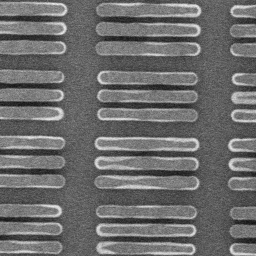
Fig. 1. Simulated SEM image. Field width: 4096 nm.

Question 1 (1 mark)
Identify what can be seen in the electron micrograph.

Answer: groups of lines, slits or small figures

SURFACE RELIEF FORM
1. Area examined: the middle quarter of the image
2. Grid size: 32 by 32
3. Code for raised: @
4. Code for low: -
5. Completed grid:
--------------------------------
--------------------------------
---------@@@@@@@@@@@@@@@@@@@@@@@
---------@@@@@@@@@@@@@@@@@@@@@@@
---------@@@@@@@@@@@@@@@@@@@@@@@
--------------------------------
--------------------------------
---------@@@@@@@@@@@@@@@@@@@@@@@
---------@@@@@@@@@@@@@@@@@@@@@@@
----------------------------@@@@
--------------------------------
---------@@@@@@-----@@------@@@@
---------@@@@@@@@@@@@@@@@@@@@@@@
---------@@@@@@@@@@@@@@@@@@@@@@@
--------------------------------
--------------------------------
--------------------------------
--------------------------------
--------------------------------
--------@@@@@@@@@@@@@@@@@@@@@@@@
--------@@@@@@@@@@@@@@@@@@@@@@@@
--------------------------------
--------------------------------
---------------@@@@@@@@@--------
--------@@@@@@@@@@@@@@@@@@@@@@@@
--------@@@@@@@@@@@@@@@@@@@@@@@@
--------------------------------
--------------------------------
--------@@@@@@----@@@@@@@@@@@@@@
--------@@@@@@@@@@@@@@@@@@@@@@@@
--------@@@@@@@@@@@@@@@@@@@@@@@@
--------------------------------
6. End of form